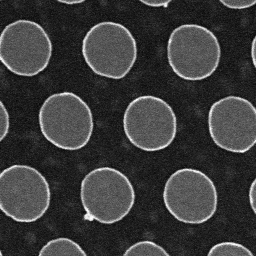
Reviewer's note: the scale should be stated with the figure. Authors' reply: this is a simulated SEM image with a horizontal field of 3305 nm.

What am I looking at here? raised bodies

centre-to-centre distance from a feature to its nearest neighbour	1.08	um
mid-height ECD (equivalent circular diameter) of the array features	696	nm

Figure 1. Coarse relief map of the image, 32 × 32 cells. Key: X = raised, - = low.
------------------XXX-------XXXX
--------------------------------
--------------------------------
-XXXX-------XXXX------XXX-------
XXXXXX-----XXXXX-----XXXXXX-----
XXXXXX----XXXXXXX----XXXXXX-----
XXXXXX----XXXXXXX----XXXXXX-----
XXXXXX-----XXXXXX----XXXXXX-----
-XXXX------XXXXX------XXXXX-----
-------------XX--------XXX------
--------------------------------
--------------------------------
------XXXX-------XXX--------XXX-
X----XXXXXX-----XXXXX-----XXXXXX
X----XXXXXX-----XXXXXX----XXXXXX
X----XXXXXX-----XXXXXX----XXXXXX
X----XXXXXX-----XXXXXX----XXXXXX
------XXXXX-----XXXXX------XXXXX
--------XX--------XX--------XXX-
--------------------------------
--------------------------------
XXXXX-------XXX-------XXX-------
XXXXXX-----XXXXX-----XXXXX------
XXXXXX----XXXXXX-----XXXXXX----X
XXXXXX----XXXXXXX----XXXXXX----X
XXXXXX----XXXXXX-----XXXXXX----X
-XXXX------XXXXX-----XXXXXX-----
--XX--------XXX--------XXX------
--------------------------------
--------------------------------
------XXX--------XX---------XX--
-----XXXXX------XXXXX-----XXXXX-